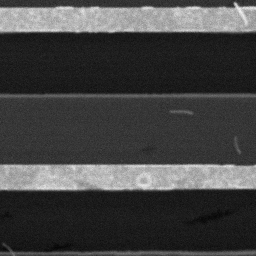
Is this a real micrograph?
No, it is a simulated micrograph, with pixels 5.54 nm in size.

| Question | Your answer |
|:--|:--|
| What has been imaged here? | lines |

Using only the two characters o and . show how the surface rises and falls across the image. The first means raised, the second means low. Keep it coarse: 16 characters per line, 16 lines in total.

oooooooooooooooo
oooooooooooooooo
................
................
................
................
oooooooooooooooo
oooooooooooooooo
oooooooooooooooo
oooooooooooooooo
oooooooooooooooo
oooooooooooooooo
................
................
................
................